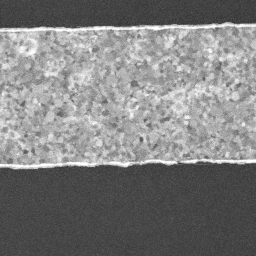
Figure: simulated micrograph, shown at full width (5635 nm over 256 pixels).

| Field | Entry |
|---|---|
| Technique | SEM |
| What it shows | one or a few lines or trenches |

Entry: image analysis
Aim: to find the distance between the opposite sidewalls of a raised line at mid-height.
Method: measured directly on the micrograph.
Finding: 2950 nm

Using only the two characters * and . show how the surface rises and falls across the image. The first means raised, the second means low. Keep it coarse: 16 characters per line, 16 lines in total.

................
................
****************
****************
****************
****************
****************
****************
****************
****************
................
................
................
................
................
................